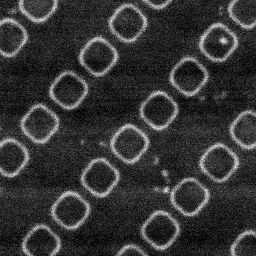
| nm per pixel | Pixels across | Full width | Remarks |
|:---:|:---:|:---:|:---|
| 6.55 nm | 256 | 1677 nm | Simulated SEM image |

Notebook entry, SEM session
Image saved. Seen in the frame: a regular array of raised bodies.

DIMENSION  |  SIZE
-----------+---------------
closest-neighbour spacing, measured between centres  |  293 nanometres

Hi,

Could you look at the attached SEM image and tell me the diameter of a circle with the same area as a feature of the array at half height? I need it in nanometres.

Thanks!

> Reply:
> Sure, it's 220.